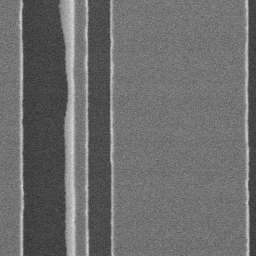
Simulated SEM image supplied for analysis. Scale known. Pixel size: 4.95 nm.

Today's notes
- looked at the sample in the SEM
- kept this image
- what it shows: lines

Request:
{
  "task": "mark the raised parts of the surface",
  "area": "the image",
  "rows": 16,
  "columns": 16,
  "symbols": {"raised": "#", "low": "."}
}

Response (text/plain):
#...###########.
#...###########.
#...###########.
#...###########.
#...###########.
#...###########.
#...###########.
#...###########.
#...###########.
#...############
#...############
#...###########.
#...############
#...############
#...############
#...############